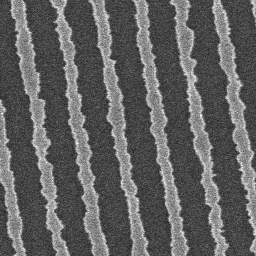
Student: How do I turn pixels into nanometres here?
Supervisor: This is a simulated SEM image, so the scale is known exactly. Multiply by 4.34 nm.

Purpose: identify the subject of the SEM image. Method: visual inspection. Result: parallel lines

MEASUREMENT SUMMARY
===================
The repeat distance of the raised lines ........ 172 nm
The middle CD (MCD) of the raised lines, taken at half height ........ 51.3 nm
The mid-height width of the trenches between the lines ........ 120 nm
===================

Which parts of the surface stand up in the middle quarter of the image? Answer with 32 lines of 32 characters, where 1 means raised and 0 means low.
11100000001100000000111000000111
11100000001100000000111000000011
11100000001110000000111000000011
01100000001110000000111000000001
01100000001110000000111000000001
01100000000110000000011100000001
01100000000111000000011100000001
01110000000111000000011100000001
01110000000111100000011100000001
01110000000011000000011100000001
01110000000111100000011110000001
01110000000111100000001110000001
00110000000111100000011110000000
00111000000111100000001110000001
01111000000111100000001111000000
00111000000011100000001110000000
00111000000011100000001110000000
00111100000011100000001110000000
00011100000001100000000111000000
00011100000001110000000111000000
00011100000001110000000111000000
00011110000001100000000111000000
00011110000001110000000111000000
00011100000001110000000111000000
00011100000000110000000111000000
00001100000000111000000011100000
00001110000000111000000011100000
00001110000000111000000001100000
00001111000000111000000001100000
00001110000000111000000001100000
00000110000000111100000001110000
00000111000000011100000001110000